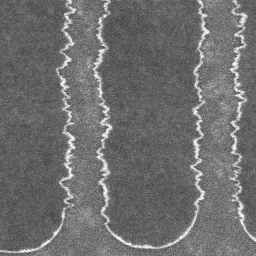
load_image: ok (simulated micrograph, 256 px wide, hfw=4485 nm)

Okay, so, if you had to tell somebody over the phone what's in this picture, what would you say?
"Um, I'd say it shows one or a few lines or trenches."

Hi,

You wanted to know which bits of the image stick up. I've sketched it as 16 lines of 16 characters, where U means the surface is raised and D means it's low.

UUUUDDDUUUUUUDDU
UUUUDDUUUUUUUDDU
UUUUDDUUUUUUUDDU
UUUUDDUUUUUUUDDU
UUUUDDUUUUUUDDDU
UUUUDDUUUUUUDDDU
UUUUDDUUUUUUUDDU
UUUUDDDUUUUUDDDU
UUUUDDDUUUUUDDDU
UUUUDDUUUUUUDDDU
UUUUDDUUUUUUDDDU
UUUUDDUUUUUUDDDU
UUUUDDDUUUUUDDDU
UUUUDDDUUUUUDDDU
UUUUDDDUUUUUDDDU
UUDDDDDDDDDDDDDD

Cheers